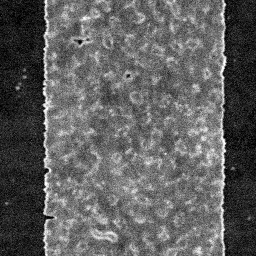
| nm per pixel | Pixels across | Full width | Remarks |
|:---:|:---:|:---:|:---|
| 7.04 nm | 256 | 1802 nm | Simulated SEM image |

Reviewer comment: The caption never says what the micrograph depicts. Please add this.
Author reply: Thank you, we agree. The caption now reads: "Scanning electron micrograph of one or a few lines or trenches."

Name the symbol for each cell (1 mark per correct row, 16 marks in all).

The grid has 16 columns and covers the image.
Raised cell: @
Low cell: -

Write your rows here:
---@@@@@@@@@@@--
---@@@@@@@@@@@--
---@@@@@@@@@@@--
---@@@@@@@@@@@--
---@@@@@@@@@@@--
---@@@@@@@@@@@--
---@@@@@@@@@@@--
---@@@@@@@@@@@--
---@@@@@@@@@@@--
---@@@@@@@@@@@--
---@@@@@@@@@@@--
---@@@@@@@@@@@--
---@@@@@@@@@@@--
---@@@@@@@@@@@--
---@@@@@@@@@@@--
---@@@@@@@@@@@--